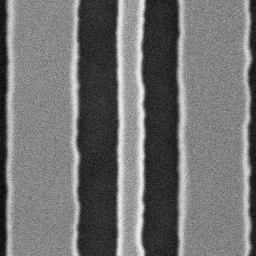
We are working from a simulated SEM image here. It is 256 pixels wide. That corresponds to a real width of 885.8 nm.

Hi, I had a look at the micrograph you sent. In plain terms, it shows lines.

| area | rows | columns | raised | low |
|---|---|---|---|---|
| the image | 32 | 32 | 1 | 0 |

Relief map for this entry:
01111111110000011100001111111110
01111111110000011100001111111110
01111111110000011100001111111110
01111111110000011100001111111110
01111111110000011100001111111110
01111111110000011100001111111110
01111111110000011100001111111110
01111111110000011100001111111110
01111111100000011100001111111110
01111111100000011100001111111110
01111111110000011100001111111110
01111111110000011100001111111110
01111111110000011100001111111110
01111111110000011100000111111110
01111111110000011100000111111110
01111111110000011100001111111110
01111111110000011100001111111110
01111111100000011100001111111110
01111111110000011100001111111110
01111111110000011100000111111110
01111111110000011100000111111110
01111111110000011100000111111110
01111111110000011100000111111110
01111111110000011100000111111110
01111111110000011100001111111110
01111111110000011100001111111110
01111111110000011100001111111110
01111111110000011100001111111110
01111111110000011100001111111110
01111111110000011000001111111110
01111111100000011100001111111110
01111111110000011100001111111110